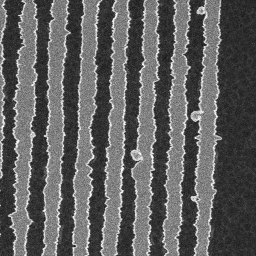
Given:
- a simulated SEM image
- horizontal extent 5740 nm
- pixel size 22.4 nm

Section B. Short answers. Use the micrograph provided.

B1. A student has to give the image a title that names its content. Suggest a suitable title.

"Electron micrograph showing parallel lines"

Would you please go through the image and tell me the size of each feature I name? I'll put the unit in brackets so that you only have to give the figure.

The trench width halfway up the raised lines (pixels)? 15.4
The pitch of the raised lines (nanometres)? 682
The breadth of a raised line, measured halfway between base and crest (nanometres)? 330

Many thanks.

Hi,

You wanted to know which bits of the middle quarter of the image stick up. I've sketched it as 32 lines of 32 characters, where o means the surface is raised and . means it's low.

....oooo....ooo.....oooo...oooo.
....oooo....ooo.o..oooo....oooo.
....oooo....ooo....oooo....oooo.
....oooo....ooo....ooooo...ooo..
....oooo...oooo....oooo....ooo..
....oooo....ooo....oooo....ooo..
....oooo....ooo....oooo....oooo.
....oooo....ooo....oooo....ooo..
....ooo.....ooo....oooo....ooo..
....oooo....ooo....oooo...ooooo.
....oooo....ooo....ooo....ooooo.
....oooo....ooo....ooo....ooooo.
....ooo.....ooo....ooo....ooooo.
....ooo....oooo...oooo.....oooo.
....ooo....oooo....oooo....ooo..
....ooo.....ooo....oooo....ooo..
....ooo....oooo...ooooo....ooo..
....ooo....oooo....oooo...oooo..
....ooo....oooo....oooo....ooo..
...oooo....oooo...ooooo....ooo..
...oooo....oooo...oooo.....ooo..
....ooo....oooo...oooo....oooo..
...oooo....oooo..ooooo....oooo..
...oooo....oooo..ooooo....oooo..
...ooo.....oooo....ooo....oooo..
...ooo.....oooo...oooo....oooo..
...oooo...ooooo..ooooo....oooo..
...ooo.....ooo...ooooo....oooo..
...oooo....ooo...ooooo....oooo..
..ooooo...oooo....oooo....ooo...
..ooooo...oooo....ooo....oooo...
...oooo...oooo....oooo....ooo...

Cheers